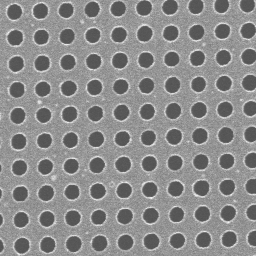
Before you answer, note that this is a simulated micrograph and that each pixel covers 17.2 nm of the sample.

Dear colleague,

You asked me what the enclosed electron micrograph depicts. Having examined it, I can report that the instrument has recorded a regular array of holes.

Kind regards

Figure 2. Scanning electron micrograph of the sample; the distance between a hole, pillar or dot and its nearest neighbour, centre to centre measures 25.7 pixels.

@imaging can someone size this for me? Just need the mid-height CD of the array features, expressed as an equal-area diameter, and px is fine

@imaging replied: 15.6